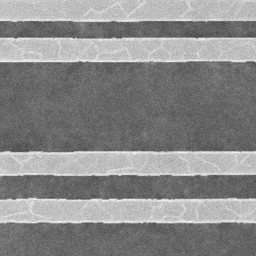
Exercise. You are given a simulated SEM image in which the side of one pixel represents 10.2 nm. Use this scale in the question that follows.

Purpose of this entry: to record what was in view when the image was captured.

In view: lines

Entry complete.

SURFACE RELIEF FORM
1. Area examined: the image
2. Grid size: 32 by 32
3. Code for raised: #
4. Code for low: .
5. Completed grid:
################################
################################
################################
................................
................................
################################
################################
################################
................................
................................
................................
................................
................................
................................
................................
................................
................................
................................
................................
################################
################################
################################
................................
................................
................................
################################
################################
################################
................................
................................
................................
................................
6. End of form